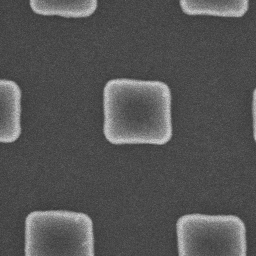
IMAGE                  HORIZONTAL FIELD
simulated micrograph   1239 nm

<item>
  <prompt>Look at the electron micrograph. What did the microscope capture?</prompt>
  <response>raised bodies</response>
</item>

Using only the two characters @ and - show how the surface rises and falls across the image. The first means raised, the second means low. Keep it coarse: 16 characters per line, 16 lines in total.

--@@@@------@@@-
----------------
----------------
----------------
----------------
@------@@@------
@------@@@@-----
@------@@@@-----
@------@@@@-----
----------------
----------------
----------------
----------------
--@@@-----------
--@@@@-----@@@@-
--@@@@-----@@@@-